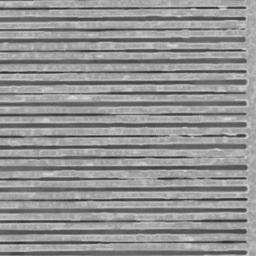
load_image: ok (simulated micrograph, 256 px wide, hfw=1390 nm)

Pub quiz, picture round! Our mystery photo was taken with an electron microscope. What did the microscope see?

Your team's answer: parallel lines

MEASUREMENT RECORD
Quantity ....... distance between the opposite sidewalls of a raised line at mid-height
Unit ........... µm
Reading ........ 0.0373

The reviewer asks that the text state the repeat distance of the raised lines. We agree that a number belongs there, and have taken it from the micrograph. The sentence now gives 57.7 nm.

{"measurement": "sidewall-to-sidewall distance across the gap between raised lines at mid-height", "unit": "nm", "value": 23.1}